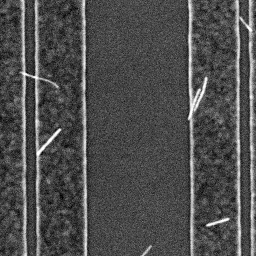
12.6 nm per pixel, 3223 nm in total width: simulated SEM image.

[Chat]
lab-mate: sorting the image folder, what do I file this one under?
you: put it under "wiring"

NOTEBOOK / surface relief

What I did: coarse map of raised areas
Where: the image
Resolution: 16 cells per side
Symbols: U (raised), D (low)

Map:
UDUUUDDDDDDDUUUD
UDUUUDDDDDDDUUUD
UDUUUDDDDDDDUUUD
UUUUUDDDDDDDUUUD
UUUUUDDDDDDDUUUD
UUUUUDDDDDDDUUUD
UUUUUDDDDDDDUUUD
UUUUUDDDDDDDUUUD
UUUUUDDDDDDDUUUD
UUUUUDDDDDDDUUUD
UUUUUDDDDDDDUUUD
UUUUUDDDDDDDUUUD
UUUUUDDDDDDDUUUD
UUUUUDDDDDDDUUUD
UUUUUDDDDDDDUUUD
UUUUUDDDDDDDUUUD